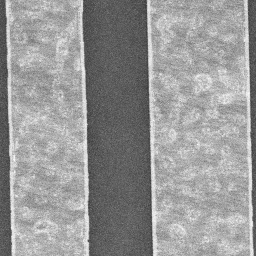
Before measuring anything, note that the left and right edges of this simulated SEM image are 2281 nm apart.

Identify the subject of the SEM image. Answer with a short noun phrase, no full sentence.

one or a few lines or trenches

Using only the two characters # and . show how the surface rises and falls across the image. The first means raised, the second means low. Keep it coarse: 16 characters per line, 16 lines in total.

#####....######.
.####....######.
.####....######.
.####....######.
.####....#######
.####....######.
.####....#######
.####.....######
.####.....######
.####.....######
.####.....######
.####.....######
.####.....######
.####.....######
.####.....######
.####.....######